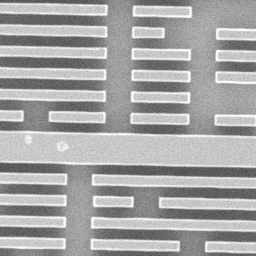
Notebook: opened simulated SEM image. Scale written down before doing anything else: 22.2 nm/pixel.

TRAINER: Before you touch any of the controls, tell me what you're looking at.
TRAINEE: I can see groups of lines, slits or small figures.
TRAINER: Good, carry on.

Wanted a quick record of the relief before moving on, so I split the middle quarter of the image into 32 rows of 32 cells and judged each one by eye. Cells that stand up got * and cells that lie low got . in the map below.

................................
******..........................
**********.......**************.
**********.......**************.
................................
................................
................................
**********.......**************.
**********.......**************.
......................*********.
................................
................................
**********.......********.......
**********.......**************.
.........*.......**************.
................................
................................
*********.......................
********************************
********************************
********************************
********************************
********************************
********************************
********************************
................................
................................
................................
*......*************************
*......*************************
..............................**
................................